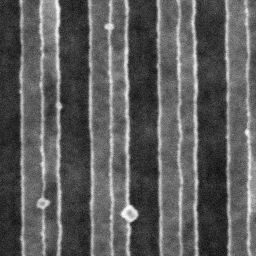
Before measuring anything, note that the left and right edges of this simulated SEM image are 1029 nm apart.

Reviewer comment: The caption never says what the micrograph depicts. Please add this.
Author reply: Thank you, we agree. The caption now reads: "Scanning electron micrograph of lines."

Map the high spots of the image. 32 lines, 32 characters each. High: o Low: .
...oooo....ooooo....oooo....oooo
...oooo....ooooo....oooo....oooo
...oooo....ooooo....oooo....oooo
...oooo....ooooo....oooo....oooo
...oooo....ooooo....oooo....oooo
...oooo....ooooo....oooo....oooo
...oooo....ooooo....oooo....oooo
...oooo....ooooo....oooo....oooo
...oooo....ooooo....oooo.....ooo
...oooo....ooooo....oooo....oooo
...oooo....ooooo....oooo.....ooo
...oooo....ooooo....ooooo....ooo
...oooo....ooooo....oooo....oooo
...ooooo...ooooo....oooo.....ooo
...oooo....ooooo....oooo.....ooo
...oooo....ooooo....oooo.....ooo
...oooo....ooooo....oooo.....ooo
...oooo....ooooo....oooo.....ooo
...oooo....ooooo....oooo.....ooo
...oooo....ooooo....oooo.....ooo
...oooo....ooooo....oooo.....ooo
...oooo....ooooo....oooo.....ooo
...oooo....ooooo....ooooo....ooo
...oooo....ooooo....oooo.....ooo
...oooo....ooooo....oooo.....ooo
...oooo....ooooo....oooo.....ooo
...oooo....oooooo...oooo.....ooo
...oooo....oooooo...oooo.....ooo
...ooooo....oooo....oooo.....ooo
...ooooo....oooo....ooooo....ooo
...oooo....ooooo....oooo.....ooo
...oooo....ooooo....ooooo....ooo